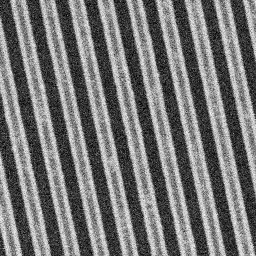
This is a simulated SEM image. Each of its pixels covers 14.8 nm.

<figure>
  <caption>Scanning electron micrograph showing parallel lines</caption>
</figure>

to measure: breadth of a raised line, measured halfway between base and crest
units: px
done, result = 11.3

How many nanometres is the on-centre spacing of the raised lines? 421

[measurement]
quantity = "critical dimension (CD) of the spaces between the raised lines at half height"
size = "255 nanometres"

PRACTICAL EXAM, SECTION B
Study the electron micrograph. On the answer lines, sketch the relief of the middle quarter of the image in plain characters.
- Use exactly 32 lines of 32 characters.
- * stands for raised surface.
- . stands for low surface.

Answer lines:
*....***....***.....***....***..
*....***.....**.....***....***..
*.....**.....***....***....***..
*.....***....***....***.....**..
**....***....***.....**.....***.
**....***.....**.....***....***.
**....***.....***....***....***.
**.....**.....***....***....***.
**.....***....***....***.....***
***....***....***.....**.....***
***....***.....**.....***....***
***.....**.....***....***....***
***.....***....***....***....***
.**.....***....***.....**.....**
.***....***....***.....***....**
.***....***.....**.....***....**
.***.....**.....***....***....**
..**.....***....***....***.....*
..***....***....***.....**.....*
..***....***.....**.....***....*
..***....***.....***....***....*
..***.....**.....***....***.....
...**.....***....***....***.....
...***....***....***.....**.....
...***....***.....**.....***....
...***.....**.....***....***....
...***.....***....***....***....
....**.....***....***.....**....
....***....***....***.....***...
....***....***.....**.....***...
....***.....**.....***....***...
.....**.....***....***....***...